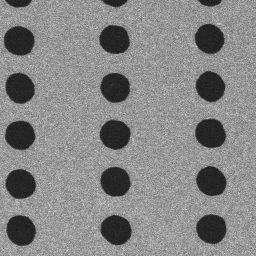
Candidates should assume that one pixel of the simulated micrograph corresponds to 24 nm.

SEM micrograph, a regular array of holes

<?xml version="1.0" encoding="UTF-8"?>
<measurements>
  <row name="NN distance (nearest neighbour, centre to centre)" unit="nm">1130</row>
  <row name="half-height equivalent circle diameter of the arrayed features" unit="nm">727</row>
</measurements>